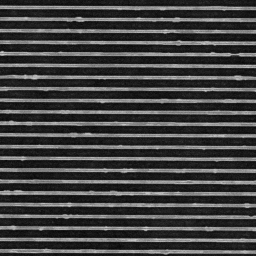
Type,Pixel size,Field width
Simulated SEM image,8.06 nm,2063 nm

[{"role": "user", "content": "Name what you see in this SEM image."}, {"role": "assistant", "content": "parallel lines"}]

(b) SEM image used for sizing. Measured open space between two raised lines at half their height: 70.5 nm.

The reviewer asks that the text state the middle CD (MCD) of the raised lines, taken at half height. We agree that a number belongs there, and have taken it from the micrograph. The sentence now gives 24.2 nm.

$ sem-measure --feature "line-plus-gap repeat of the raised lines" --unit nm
93.5